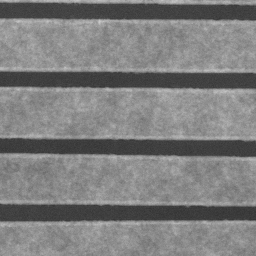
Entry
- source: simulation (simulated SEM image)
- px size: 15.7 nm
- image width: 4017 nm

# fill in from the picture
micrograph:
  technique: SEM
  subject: lines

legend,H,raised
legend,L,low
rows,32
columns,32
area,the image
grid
LLLLLLLLLLLLLLLLLLLLLLLLLLLLLLLL
LLLLLLLLLLLLLLLLLLLLLLLLLLLLLLLL
HHHHHHLLLLLLLLLLLLLLLLLLLLLLLLLL
HHHHHHHHHHHHHHHHHHHHHHHHHHHHHHHH
HHHHHHHHHHHHHHHHHHHHHHHHHHHHHHHH
HHHHHHHHHHHHHHHHHHHHHHHHHHHHHHHH
HHHHHHHHHHHHHHHHHHHHHHHHHHHHHHHH
HHHHHHHHHHHHHHHHHHHHHHHHHHHHHHHH
HHHHHHHHHHHHHHHHHHHHHHHHHHHHHHHH
LLLLLLLLLLLLLLLLLLLLLLLLLLLLLLLL
LLLLLLLLLLLLLLLLLLLLLLLLLLLLLLLL
HHHHHHHHHHHHHHHHHHHHHHHHHHHHHHHH
HHHHHHHHHHHHHHHHHHHHHHHHHHHHHHHH
HHHHHHHHHHHHHHHHHHHHHHHHHHHHHHHH
HHHHHHHHHHHHHHHHHHHHHHHHHHHHHHHH
HHHHHHHHHHHHHHHHHHHHHHHHHHHHHHHH
HHHHHHHHHHHHHHHHHHHHHHHHHHHHHHHH
LLLLLLLLLLLLLLLLLLLLLLLLLLLLLLLL
LLLLLLLLLLLLLLLLLLLLLLLLLLLLLLLL
HHHHHHHHHHHHHHHHHHHLLLLLLLLLLLLL
HHHHHHHHHHHHHHHHHHHHHHHHHHHHHHHH
HHHHHHHHHHHHHHHHHHHHHHHHHHHHHHHH
HHHHHHHHHHHHHHHHHHHHHHHHHHHHHHHH
HHHHHHHHHHHHHHHHHHHHHHHHHHHHHHHH
HHHHHHHHHHHHHHHHHHHHHHHHHHHHHHHH
LLLLLLLLLLLLLLLLLLHHHHHHHHHHHHHH
LLLLLLLLLLLLLLLLLLLLLLLLLLLLLLLL
LLLLLLLLLLLLLLLLLLLLLLLLLLLLLLLL
HHHHHHHHHHHHHHHHHHHHHHHHHHHHHHHH
HHHHHHHHHHHHHHHHHHHHHHHHHHHHHHHH
HHHHHHHHHHHHHHHHHHHHHHHHHHHHHHHH
HHHHHHHHHHHHHHHHHHHHHHHHHHHHHHHH